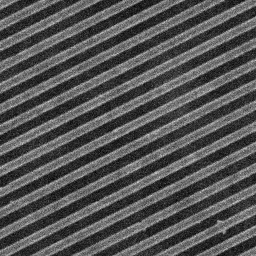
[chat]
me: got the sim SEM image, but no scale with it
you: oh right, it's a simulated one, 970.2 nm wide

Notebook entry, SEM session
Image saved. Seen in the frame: parallel lines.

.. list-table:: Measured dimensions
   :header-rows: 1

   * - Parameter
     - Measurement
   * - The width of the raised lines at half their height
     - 0.0291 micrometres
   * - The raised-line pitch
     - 70.5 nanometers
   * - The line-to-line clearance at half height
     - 40.1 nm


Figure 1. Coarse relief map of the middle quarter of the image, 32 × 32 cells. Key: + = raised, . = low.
...++++......+++++......++++....
.++++......+++++......++++......
+++......+++++......++++......++
+.......++++......++++......++++
......++++......++++......++++..
....++++......++++......++++....
..++++......++++......++++......
++++......++++......++++.......+
++......++++......++++.......+++
......++++......++++.......++++.
....++++......++++.......++++...
..++++......++++.......++++.....
++++......++++.......++++......+
++......++++.......++++......+++
......++++.......++++......++++.
....++++.......++++......++++...
..+++++......++++......++++.....
.++++......++++......++++......+
+++......++++......++++.......++
+......++++......++++......+++++
.....++++......++++.......++++..
...++++......++++.......++++....
.++++......++++......+++++......
+++......++++......+++++......++
+......++++......+++++......++++
.....++++.......++++......++++..
...++++.......++++......++++....
.++++.......++++......++++......
+++.......++++......++++......++
++......++++......++++......++++
......++++......++++......+++++.
....++++......++++......+++++...